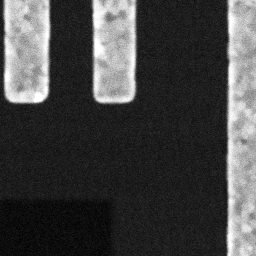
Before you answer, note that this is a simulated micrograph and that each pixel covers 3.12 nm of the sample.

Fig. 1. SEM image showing wiring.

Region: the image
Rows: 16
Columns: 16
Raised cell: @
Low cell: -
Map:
@@@---@@------@@
@@@---@@------@@
@@@---@@------@@
@@@---@@------@@
@@@---@@------@@
@@@---@@------@@
--------------@@
--------------@@
--------------@@
--------------@@
--------------@@
--------------@@
--------------@@
--------------@@
--------------@@
--------------@@